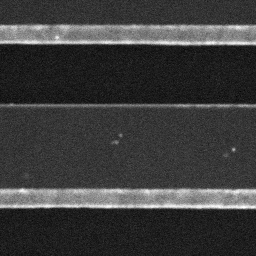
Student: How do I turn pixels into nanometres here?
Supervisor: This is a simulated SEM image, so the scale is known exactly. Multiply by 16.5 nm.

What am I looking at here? lines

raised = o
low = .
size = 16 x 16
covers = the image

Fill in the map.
oooooooooooooooo
oooooooooooooooo
oooooooooooooooo
................
................
................
................
oooooooooooooooo
oooooooooooooooo
oooooooooooooooo
oooooooooooooooo
oooooooooooooooo
oooooooooooooooo
................
................
................